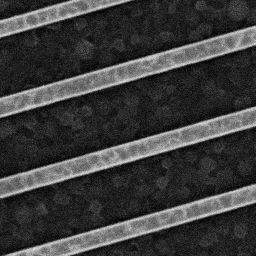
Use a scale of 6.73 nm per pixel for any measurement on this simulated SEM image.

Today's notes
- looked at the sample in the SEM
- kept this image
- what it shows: one or a few lines or trenches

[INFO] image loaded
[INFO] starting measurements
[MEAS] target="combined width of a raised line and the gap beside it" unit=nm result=513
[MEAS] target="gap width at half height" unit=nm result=405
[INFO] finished